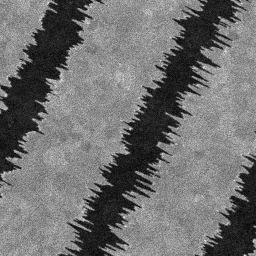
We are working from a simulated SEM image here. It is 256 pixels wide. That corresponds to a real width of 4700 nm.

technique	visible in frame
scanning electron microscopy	one or a few lines or trenches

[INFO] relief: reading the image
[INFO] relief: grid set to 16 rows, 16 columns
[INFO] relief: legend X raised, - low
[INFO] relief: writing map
XXX--XXXXXXX---X
XX---XXXXXX---XX
XX---XXXXXX---XX
XX--XXXXXX---XXX
X---XXXXXX---XXX
---XXXXXX---XXXX
---XXXXXX--XXXXX
--XXXXXX---XXXXX
--XXXXXX---XXXXX
-XXXXXXX--XXXXXX
-XXXXXX---XXXXX-
XXXXXX---XXXXXX-
XXXXXX--XXXXXXX-
XXXXX---XXXXXX--
XXXXX--XXXXXXX--
XXXXX--XXXXXX---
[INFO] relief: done